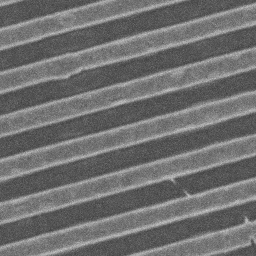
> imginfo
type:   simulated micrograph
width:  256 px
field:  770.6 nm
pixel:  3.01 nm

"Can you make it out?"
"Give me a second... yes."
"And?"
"parallel lines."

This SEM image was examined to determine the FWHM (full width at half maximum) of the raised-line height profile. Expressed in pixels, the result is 19.4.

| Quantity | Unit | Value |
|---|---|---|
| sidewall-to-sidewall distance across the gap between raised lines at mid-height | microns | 0.0672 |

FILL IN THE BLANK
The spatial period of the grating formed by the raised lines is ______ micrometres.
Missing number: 0.127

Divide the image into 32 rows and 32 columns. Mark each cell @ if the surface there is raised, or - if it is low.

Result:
@-----------@@@@@@@@@-----------
--------@@@@@@@@@-----------@@@@
----@@@@@@@@@------------@@@@@@@
@@@@@@@@@@-----------@@@@@@@@@--
@@@@@@-----------@@@@@@@@@@-----
@@-----------@@@@@@@@@@---------
----------@@@@@@@@@-----------@@
------@@@@@@@@@-----------@@@@@@
--@@@@@@@@@-----------@@@@@@@@@@
@@@@@@@@@----------@@@@@@@@@----
@@@@-----------@@@@@@@@@--------
@----------@@@@@@@@@@----------@
--------@@@@@@@@@-----------@@@@
----@@@@@@@@@-----------@@@@@@@@
@@@@@@@@@-----------@@@@@@@@@@--
@@@@@@-----------@@@@@@@@@------
@@-----------@@@@@@@@@----------
---------@@@@@@@@@-----------@@@
-----@@@@@@@@@@-----------@@@@@@
--@@@@@@@@@-----------@@@@@@@@@-
@@@@@@@------------@@@@@@@@@----
@@@@-----------@@@@@@@@@--------
-----------@@@@@@@@@-----------@
-------@@@@@@@@@@----------@@@@@
----@@@@@@@@@-----------@@@@@@@@
@@@@@@@@@-----------@@@@@@@@@@--
@@@@@-----------@@@@@@@@@@------
@@-----------@@@@@@@@@----------
---------@@@@@@@@@@----------@@@
-----@@@@@@@@@@----------@@@@@@@
-@@@@@@@@@@-----------@@@@@@@@@-
@@@@@@@-----------@@@@@@@@@@----